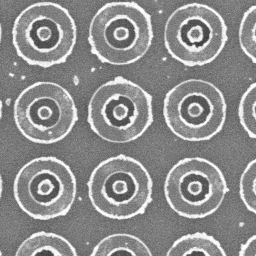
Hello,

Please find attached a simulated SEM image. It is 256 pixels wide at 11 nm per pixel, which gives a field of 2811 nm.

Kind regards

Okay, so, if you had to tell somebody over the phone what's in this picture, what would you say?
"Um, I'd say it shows a regular array of ring-shaped raised bodies with a dot in the middle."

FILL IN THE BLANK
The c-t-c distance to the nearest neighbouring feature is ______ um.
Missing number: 0.822